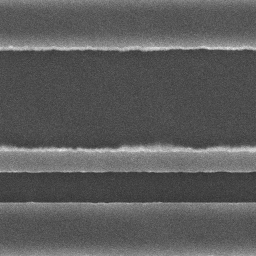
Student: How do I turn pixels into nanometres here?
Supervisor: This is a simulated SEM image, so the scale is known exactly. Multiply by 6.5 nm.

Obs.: lines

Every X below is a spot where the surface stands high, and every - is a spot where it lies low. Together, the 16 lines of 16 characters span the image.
XXXXXXXXXXXXXXXX
XXXXXXXXXXXXXXXX
XXXXXXXXXXXXXXXX
----------------
----------------
----------------
----------------
----------------
----------------
XXXXXXXXXXXXXXXX
XXXXXXXXXXXXXXXX
----------------
----------------
XXXXXXXXXXXXXXXX
XXXXXXXXXXXXXXXX
XXXXXXXXXXXXXXXX